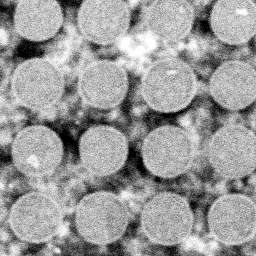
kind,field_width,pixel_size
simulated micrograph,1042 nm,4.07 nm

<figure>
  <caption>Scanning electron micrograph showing a regular array of raised bodies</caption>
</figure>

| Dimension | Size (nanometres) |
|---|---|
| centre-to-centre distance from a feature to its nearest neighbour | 265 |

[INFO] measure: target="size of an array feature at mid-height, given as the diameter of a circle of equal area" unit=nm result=209